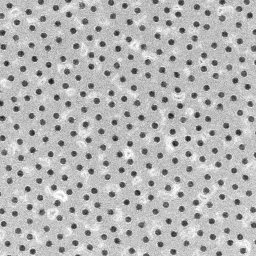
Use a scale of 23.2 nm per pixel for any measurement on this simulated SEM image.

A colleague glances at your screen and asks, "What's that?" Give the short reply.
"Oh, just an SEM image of a regular array of holes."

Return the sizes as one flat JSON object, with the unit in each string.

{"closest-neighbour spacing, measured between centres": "316 nm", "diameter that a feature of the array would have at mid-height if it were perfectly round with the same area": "0.157 micrometres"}